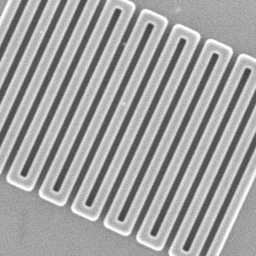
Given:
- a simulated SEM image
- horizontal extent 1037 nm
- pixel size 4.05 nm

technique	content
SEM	groups of lines, slits or small figures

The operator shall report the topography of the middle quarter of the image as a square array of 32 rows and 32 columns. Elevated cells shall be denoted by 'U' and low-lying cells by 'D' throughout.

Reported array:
UDDUUUDDUUUDDUUUDDUUUDDUUUDDUUUD
UDDUUUDDUUUDDUUUDDUUDDUUUDDUUUDD
DDUUUDDUUUDDUUUDDUUUDDUUUDDUUUDD
DDUUUDDUUUDDUUUDDUUUDDUUUDDUUUDU
DDUUDDUUUDDUUUDDUUUDDUUUDDUUUDDU
DUUUDDUUUDDUUUDDUUUDDUUUDUUUDDUU
DUUDDUUUDDUUUDDUUUDDUUUDDUUUDDUU
UUUDDUUUDDUUUDDUUUDDUUUDDUUUDDUU
UUUDDUUUDUUUDDUUUDDUUUDDUUUDDUUU
UUDDUUUDDUUUDDUUUDDUUUDDUUUDDUUU
UUDDUUUDDUUDDUUUDDUUUDDUUUDDUUUD
UDDUUUDDUUUDDUUUDDUUUDDUUUDDUUUD
UDDUUUDDUUUDDUUUDDUUDDUUUDDUUUDD
DDUUUDDUUUDDUUUDDUUUDDUUUDDUUUDD
DDUUUDDUUUDDUUUDDUUDDDUUDDUUUDDU
DUUUDDUUUDDUUUDDUUUDDUUUDDUUUDDU
DUUUDDUUUDDUUUDDUUUDDUUUDUUUDDUU
UUUDDUUUDDUUUDDUUUDDUUUDDUUUDDUU
UUUDDUUUDDUUUDDUUUDDUUDDDUUDDUUU
UUDDDUUDDUUUDDUUUDDUUUDDUUUDDUUU
UUDDUUUDDUUUDDUUUDDUUUDDUUUDUUUD
UUDUUUDDUUUDDUUUDDUUUDDUUUDDUUUD
UDDUUUDDUUUDDUUUDDUUUDDUUUDDUUUD
UDDUUDDDUUDDDUUDDUUUDDUUUDDUUUDD
DDUUUDDUUUDDUUUDDUUUDDUUUDDUUUDD
DDUUUDDUUDDUUUDDUUUDDUUUDDUUUDDU
DUUUDDUUUDDUUUDDUUUDDUUUDDUUUDDU
DUUUDDUUUDDUUUDDUUDDUUUDDUUUDDUU
UUUDDUUUDDUUUDDUUUDDUUUDDUUUDDUU
UUUDDUUUDDUUUDUUUDDUUUDDUUUDDUUU
UUDDUUUDDUUUDDUUUDDUUUDDUUUDDUUU
UUDDUUUDDUUUDDUUUDDUUUDDUUDDUUUD